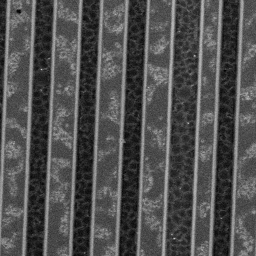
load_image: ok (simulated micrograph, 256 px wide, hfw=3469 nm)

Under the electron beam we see parallel lines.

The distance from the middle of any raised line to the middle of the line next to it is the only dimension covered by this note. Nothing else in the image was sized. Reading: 646 nm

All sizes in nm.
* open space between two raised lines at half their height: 281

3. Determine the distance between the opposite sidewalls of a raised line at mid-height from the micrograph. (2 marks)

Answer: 345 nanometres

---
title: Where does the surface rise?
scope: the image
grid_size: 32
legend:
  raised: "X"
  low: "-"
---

-XXX---XXX---XXX--XXXX---XXX--XX
-XXX---XXX---XXX---XXX---XXX--XX
-XXX---XXX---XXX---XXX---XX---XX
-XXX---XXX---XXX--XXXX---XX---XX
-XXX---XXX---XXX--XXXX---XX---XX
-XXX---XXX--XXXX--XXX----XX---XX
-XXX---XXX--XXXX--XXX----XX---XX
-XXX---XXX--XXXX--XXX----XX---XX
-XXX---XXX--XXXX--XXX----XX---XX
-XXX---XXX--XXXX--XXX----XX---XX
-XXX---XXX--XXX---XXX----XX---XX
-XXX--XXXX--XXX---XXX----XX---XX
-XXX--XXXX--XXX---XXX----XX---XX
-XXX--XXX---XXX---XXX----XX---XX
XXXX--XXX---XXX---XXX----XX---XX
XXXX--XXX---XXX---XXX----XX---XX
XXXX--XXX---XXX---XXX----XX---XX
XXXX--XXX---XXX---XXX----XX---XX
XXXX--XXX---XXX---XXX----XX---XX
XXX---XXX---XXX---XXX----XX--XXX
XXX---XXX---XXX---XXX---XXX--XXX
XXX---XXX---XXX---XXX---XXX--XXX
XXX---XXX---XXX---XXX---XXX--XXX
XXX---XXX---XXX---XXX---XXX--XXX
XXX---XXX---XXX---XXX---XXX--XXX
XXX---XXX---XXX---XXX---XXX--XXX
XXX---XXX---XXX---XXX---XXX--XXX
XXX---XXX---XXX--XXXX---XX---XXX
XXX---XXX---XXX--XXXX---XX---XXX
XXX---XXX---XXX--XXX----XX---XXX
XXX---XXX--XXXX--XXX----XX---XXX
XXX---XXX--XXXX--XXX----XX---XXX